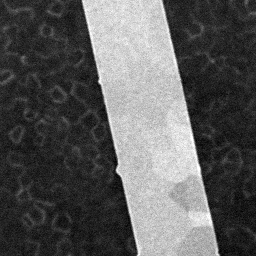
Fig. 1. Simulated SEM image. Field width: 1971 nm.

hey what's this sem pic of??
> one or a few lines or trenches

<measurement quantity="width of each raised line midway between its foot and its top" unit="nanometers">596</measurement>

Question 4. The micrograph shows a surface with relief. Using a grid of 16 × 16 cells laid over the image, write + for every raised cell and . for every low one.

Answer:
.....+++++......
......++++......
......+++++.....
......+++++.....
......+++++.....
......+++++.....
.......+++++....
.......+++++....
.......+++++....
.......+++++....
.......+++++....
........+++++...
........+++++...
........+++++...
........+++++...
.........+++++..